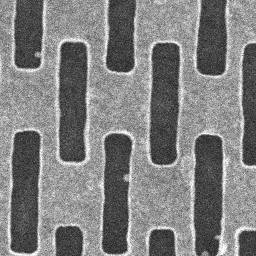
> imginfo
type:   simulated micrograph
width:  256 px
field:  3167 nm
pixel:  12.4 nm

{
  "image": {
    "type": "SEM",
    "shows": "holes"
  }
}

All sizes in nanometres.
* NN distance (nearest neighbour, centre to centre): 1130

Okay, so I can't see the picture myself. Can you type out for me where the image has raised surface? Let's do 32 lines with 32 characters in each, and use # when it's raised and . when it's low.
##...########....########...####
##...########....########...####
##...########....########...####
##...########....########...####
##...########....########...####
##...###...##....###..###...###.
##...##....##....##....#....##..
##...##....##....##....##...##..
##...##....##....##...###...##..
#######....########....###.###..
#######....########....#######..
#######....########....#######..
#######....########....#######..
#######....########...########..
#######....########...########..
#######....########...########..
##...##....########...########..
##...##....##....##...##....##..
##...##....##....##...##....##..
#....##....##...###...##....##..
#....########...###..###....###.
#....########...########....####
##...########...########....####
#....########...########....####
#....########...########....####
#....########...########....####
#....########...########....####
#....########...########....####
#....##...###...########....####
#....##...###...###...##....##..
#....##....##...###...##...###..
##..###...###...###...##...###..